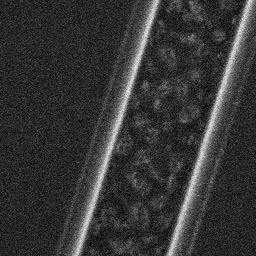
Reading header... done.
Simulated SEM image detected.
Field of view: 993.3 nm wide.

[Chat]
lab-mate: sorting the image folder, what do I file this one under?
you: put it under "one or a few lines or trenches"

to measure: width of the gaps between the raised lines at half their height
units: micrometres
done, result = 0.346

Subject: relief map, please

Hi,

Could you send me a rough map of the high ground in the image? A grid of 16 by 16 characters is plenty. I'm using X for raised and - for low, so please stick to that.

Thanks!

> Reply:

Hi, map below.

XXXXXXXXXX-----X
XXXXXXXXX------X
XXXXXXXXX------X
XXXXXXXXX------X
XXXXXXXX------XX
XXXXXXXX------XX
XXXXXXXX------XX
XXXXXXX------XXX
XXXXXXX------XXX
XXXXXXX------XXX
XXXXXX------XXXX
XXXXXX------XXXX
XXXXXX------XXXX
XXXXXX-----XXXXX
XXXXX------XXXXX
XXXXX------XXXXX